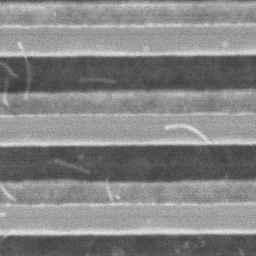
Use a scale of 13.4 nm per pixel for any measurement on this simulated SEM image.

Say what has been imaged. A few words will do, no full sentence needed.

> lines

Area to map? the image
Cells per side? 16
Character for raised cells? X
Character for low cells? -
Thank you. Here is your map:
XXXXXXXXXXXXXXXX
XXXXXXXXXXXXXXXX
XXXXXXXXXXXXXXXX
-X--------------
----------------
----------------
XXXXXXXXXXXXXXXX
XXXXXXXXXXXXXXXX
XXXXXXXXXXXXXXXX
----------------
----------------
----X-X-XX-XXXXX
XXXXXXXXXXXXXXXX
XXXXXXXXXXXXXXXX
XXXXXXXXXXXXXXXX
----------------